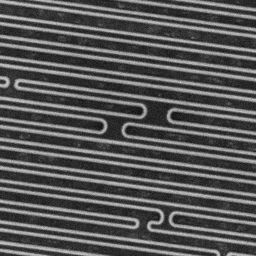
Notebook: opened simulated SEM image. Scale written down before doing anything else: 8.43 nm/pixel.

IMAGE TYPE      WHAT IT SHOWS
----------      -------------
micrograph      parallel lines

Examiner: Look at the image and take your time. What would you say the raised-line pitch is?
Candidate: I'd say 172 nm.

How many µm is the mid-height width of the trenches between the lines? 0.103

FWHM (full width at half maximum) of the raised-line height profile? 7.92 px